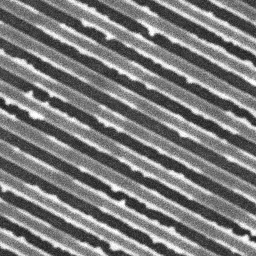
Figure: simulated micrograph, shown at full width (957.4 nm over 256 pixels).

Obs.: parallel lines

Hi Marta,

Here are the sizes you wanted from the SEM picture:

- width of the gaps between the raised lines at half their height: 41.6 nm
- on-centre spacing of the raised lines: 0.0978 µm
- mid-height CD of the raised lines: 14.7 pixels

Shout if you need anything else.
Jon